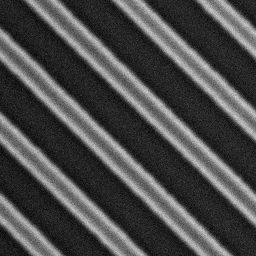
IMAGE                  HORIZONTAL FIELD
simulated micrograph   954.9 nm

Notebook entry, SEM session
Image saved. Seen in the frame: lines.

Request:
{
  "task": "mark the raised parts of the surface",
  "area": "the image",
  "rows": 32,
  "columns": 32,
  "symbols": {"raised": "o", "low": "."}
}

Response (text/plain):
....ooo........ooo.......ooo....
.....oooo.......ooo.......ooo...
......ooo........ooo.......ooo..
.......ooo........ooo.......ooo.
o.......oooo.......ooo.......ooo
oo.......oooo.......ooo.......oo
ooo.......oooo.......ooo.......o
oooo.......oooo.......ooo.......
.oooo.......oooo.......ooo......
..oooo.......oooo.......ooo.....
...oooo.......oooo.......ooo....
....oooo.......oooo.......ooo...
.....oooo.......oooo.......ooo..
.......ooo.......oooo.......ooo.
.......oooo.......oooo.......ooo
o.......oooo.......oooo.......oo
oo........ooo.......oooo.......o
ooo.......oooo.......oooo.......
.ooo........ooo.......oooo......
..ooo........ooo.......oooo.....
...ooo.......oooo.......oooo....
....ooo.......oooo.......oooo...
.....ooo........ooo.......oooo..
......ooo........ooo.......oooo.
.......ooo........ooo.......oooo
o.......oooo.......ooo.......ooo
oo.......oooo.......ooo.......oo
ooo.......ooo........ooo.......o
.ooo.......oooo.......ooo.......
..ooo.......oooo.......ooo......
...ooo.......oooo.......ooo.....
....ooo.......oooo.......ooo....